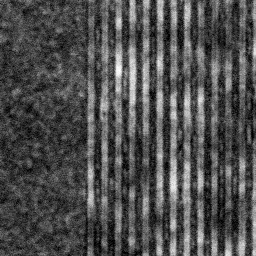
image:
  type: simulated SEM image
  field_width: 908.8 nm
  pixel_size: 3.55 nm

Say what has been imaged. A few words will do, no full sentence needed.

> parallel lines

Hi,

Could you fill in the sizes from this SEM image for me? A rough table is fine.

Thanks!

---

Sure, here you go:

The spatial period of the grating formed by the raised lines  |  49 nm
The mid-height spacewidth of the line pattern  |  0.0302 microns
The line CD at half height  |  18.2 nanometers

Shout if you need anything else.